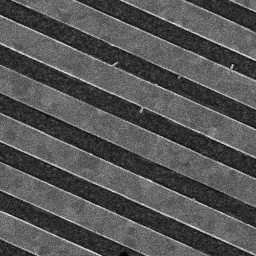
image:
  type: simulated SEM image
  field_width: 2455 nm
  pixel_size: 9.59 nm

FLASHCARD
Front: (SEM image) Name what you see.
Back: parallel lines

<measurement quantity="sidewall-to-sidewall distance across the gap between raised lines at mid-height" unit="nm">183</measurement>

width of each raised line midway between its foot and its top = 0.24 micrometres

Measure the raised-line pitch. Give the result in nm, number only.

427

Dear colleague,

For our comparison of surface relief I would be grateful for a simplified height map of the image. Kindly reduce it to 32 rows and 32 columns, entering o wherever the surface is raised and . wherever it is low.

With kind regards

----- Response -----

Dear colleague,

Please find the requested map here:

...ooooooo......oooooooo......oo
.....oooooooo.....oooooooo......
o......oooooooo......oooooooo...
ooo......oooooooo......oooooooo.
oooooo......ooooooo......ooooooo
oooooooo......oooooooo.....ooooo
..oooooooo......oooooooo......oo
.....ooooooo......oooooooo......
o......oooooooo.....ooooooooo...
ooo......oooooooo.....ooooooooo.
ooooo......oooooooo......ooooooo
ooooooo.......oooooooo.....ooooo
..oooooooo......oooooooo.....ooo
....oooooooo......oooooooo......
o......ooooooo......oooooooo....
ooo......oooooooo......ooooooo..
ooooo......oooooooo......ooooooo
ooooooo......oooooooo......ooooo
..oooooooo.....oooooooo......ooo
....oooooooo......ooooooo.......
o.....oooooooo......oooooooo....
ooo......ooooooo......oooooooo..
ooooo......oooooooo.....oooooooo
ooooooo......oooooooo......ooooo
..oooooooo.....oooooooo......ooo
....oooooooo......ooooooo......o
......oooooooo......oooooooo....
ooo.....oooooooo......oooooooo..
ooooo......oooooooo.....oooooooo
ooooooo......oooooooo......ooooo
..ooooooo......oooooooo......ooo
....ooooooo......oooooooo......o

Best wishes